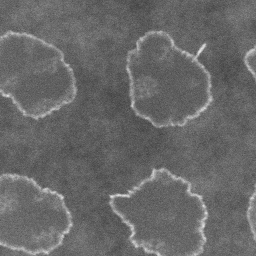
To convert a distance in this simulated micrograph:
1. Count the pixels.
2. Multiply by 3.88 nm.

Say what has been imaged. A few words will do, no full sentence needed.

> raised bodies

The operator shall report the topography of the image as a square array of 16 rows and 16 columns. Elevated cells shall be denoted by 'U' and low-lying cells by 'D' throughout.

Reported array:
DDDDDDDDDDDDDDDD
DDDDDDDDDDDDDDDD
UUDDDDDDDUUDDDDD
UUUUDDDDUUUUDDDD
UUUUDDDDUUUUUDDD
UUUUUDDDUUUUUDDD
DUUUDDDDUUUUUDDD
DDDDDDDDDUUUDDDD
DDDDDDDDDDDDDDDD
DDDDDDDDDDDDDDDD
DDDDDDDDDDDDDDDD
UUDDDDDDDUUUDDDD
UUUUDDDUUUUUDDDD
UUUUDDDDUUUUUDDD
UUUUDDDDUUUUUDDD
DUUDDDDDDUUUUDDD